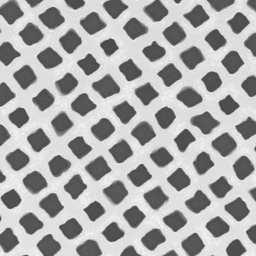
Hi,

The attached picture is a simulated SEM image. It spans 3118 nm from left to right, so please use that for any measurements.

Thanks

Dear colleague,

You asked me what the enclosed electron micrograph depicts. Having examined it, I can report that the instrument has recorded a regular array of holes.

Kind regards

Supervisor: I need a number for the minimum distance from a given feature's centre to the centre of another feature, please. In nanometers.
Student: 339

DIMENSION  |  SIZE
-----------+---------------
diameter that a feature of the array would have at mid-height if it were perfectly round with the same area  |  0.244 microns